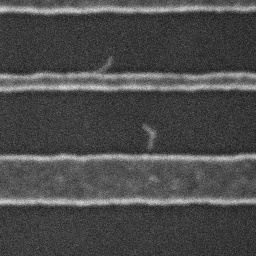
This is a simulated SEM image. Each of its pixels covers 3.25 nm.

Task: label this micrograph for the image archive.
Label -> lines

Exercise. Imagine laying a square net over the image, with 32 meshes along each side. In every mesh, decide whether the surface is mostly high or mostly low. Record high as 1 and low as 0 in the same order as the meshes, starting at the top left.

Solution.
11111111111111111111111111111111
00000110000000000000000000000000
00000000000000000000000000000000
00000000000000000000000000000000
00000000000000000000000000000000
00000000000000000000000000000000
00000000000000000000000000000000
00000000000000000000000000000000
00000000000000000000000000000000
11001111111111111111111101111111
11111111111111111111111111111111
00000000000000000000000000000000
00000000000000000000000000000000
00000000000000000000000000000000
00000000000000000000000000000000
00000000000000000000000000000000
00000000000000000000000000000000
00000000000000000000000000000000
00000000000000000000000000000000
00000000000000100000000000000011
11111111111111111111111111111111
11111111111111111111111111111111
11111111111111111111111111111111
11111111111111111111111111111111
11111111111111111111111111111111
00000000001000000000000000000000
00000000000000000000000000000000
00000000000000000000000000000000
00000000000000000000000000000000
00000000000000000000000000000000
00000000000000000000000000000000
00000000000000000000000000000000